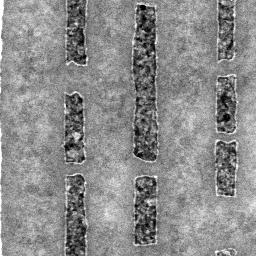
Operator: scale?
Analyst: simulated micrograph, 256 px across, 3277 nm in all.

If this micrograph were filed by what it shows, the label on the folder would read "one or a few lines or trenches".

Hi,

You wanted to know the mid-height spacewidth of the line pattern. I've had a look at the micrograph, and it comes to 0.758 microns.